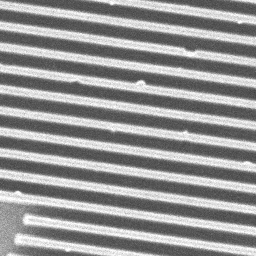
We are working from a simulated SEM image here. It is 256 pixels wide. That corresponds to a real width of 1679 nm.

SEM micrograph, parallel lines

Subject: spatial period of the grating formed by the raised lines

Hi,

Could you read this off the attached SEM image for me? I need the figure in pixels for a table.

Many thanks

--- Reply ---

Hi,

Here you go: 20.9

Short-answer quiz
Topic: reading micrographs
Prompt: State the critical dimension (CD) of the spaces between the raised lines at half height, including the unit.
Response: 71.4 nm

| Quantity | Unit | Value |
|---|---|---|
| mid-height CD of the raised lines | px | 10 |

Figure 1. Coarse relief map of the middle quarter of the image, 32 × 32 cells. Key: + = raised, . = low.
..........++++++++++++++++......
.................+++++++++++++++
+++.....................++++++++
+++++++++.....................++
.++++++++++++++++.++............
........++++++++++++++++........
...............++++++++++++++++.
++....................++++++++++
++++++++.....................+++
+++++++++++++++.................
......++++++++++++++++..........
.............++++++++++++++++...
....................++++++++++++
+++++......................+++++
++++++++++++....................
....+++++++++++++++.............
...........++++++++++++++++.....
..................++++++++++++++
+++++....................+++++++
++++++++++......................
..++++++++++++++++..............
.........+++++++++++++++........
................++++++++++++++++
+++....................+++++++++
++++++++++....................++
++++++++++++++++................
.......+++++++++++++++..........
..............+++++++++++++++...
+....................+++++++++++
++++++++....................++++
+++++++++++++...................
.....++++++++++++++++...........